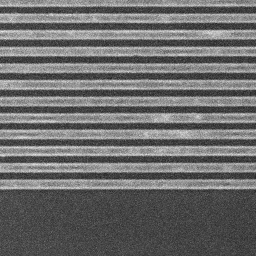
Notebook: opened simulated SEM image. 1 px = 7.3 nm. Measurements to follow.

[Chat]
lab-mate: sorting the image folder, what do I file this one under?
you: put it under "parallel lines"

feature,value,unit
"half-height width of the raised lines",0.063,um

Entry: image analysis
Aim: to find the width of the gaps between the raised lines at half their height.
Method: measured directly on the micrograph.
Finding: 56.6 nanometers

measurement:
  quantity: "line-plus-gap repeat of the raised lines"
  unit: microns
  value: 0.121